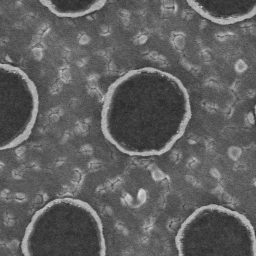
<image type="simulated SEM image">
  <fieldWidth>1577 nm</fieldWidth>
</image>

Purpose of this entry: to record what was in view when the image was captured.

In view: raised bodies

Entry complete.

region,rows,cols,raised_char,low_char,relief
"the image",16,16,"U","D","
DDDUUUDDDDDDUUUU
DDDDDDDDDDDDDDDD
DDDDDDDDDDDDDDDD
DDDDDDDDDDDDDDDD
UDDDDDDDUUDDDDDD
UUDDDDDUUUUDDDDD
UUDDDDDUUUUUDDDD
UUDDDDDUUUUUDDDD
UDDDDDDUUUUDDDDD
DDDDDDDDUUDDDDDD
DDDDDDDDDDDDDDDD
DDDDDDDDDDDDDDDD
DDDDDDDDDDDDDDDD
DDUUUUDDDDDDUUUD
DDUUUUDDDDDUUUUU
DDUUUUDDDDDUUUUU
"